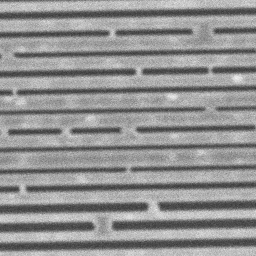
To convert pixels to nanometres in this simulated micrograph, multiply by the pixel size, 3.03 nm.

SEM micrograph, parallel lines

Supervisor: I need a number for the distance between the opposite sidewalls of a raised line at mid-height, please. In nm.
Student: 36.7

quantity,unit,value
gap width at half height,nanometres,19.7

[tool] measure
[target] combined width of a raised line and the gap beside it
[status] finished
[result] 58.2 nanometres